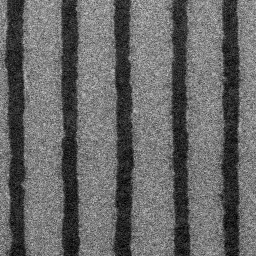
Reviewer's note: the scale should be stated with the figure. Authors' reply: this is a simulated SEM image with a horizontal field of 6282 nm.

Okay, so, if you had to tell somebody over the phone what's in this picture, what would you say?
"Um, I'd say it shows parallel lines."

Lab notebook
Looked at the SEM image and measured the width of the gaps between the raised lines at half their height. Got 890 nm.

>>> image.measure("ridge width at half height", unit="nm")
423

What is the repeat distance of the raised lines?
1.32 micrometres